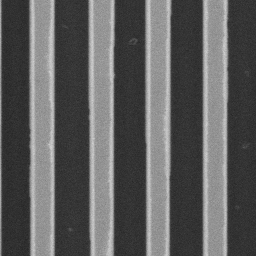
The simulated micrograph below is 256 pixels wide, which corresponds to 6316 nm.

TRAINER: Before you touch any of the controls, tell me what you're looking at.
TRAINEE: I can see lines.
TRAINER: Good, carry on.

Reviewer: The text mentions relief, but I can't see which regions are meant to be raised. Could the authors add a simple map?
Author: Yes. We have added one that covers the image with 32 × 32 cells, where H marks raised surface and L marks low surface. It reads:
LLLLHHHLLLLHHHLLLLHHHLLLLLHHLLLL
LLLLHHHLLLLHHHLLLLHHHLLLLLHHLLLL
LLLLHHHLLLLHHHLLLLHHHLLLLLHHLLLL
LLLLHHHLLLLHHHLLLLHHHLLLLHHHLLLL
LLLLHHHLLLLHHHLLLLHHHLLLLHHHLLLL
LLLLHHHLLLLHHHLLLLHHHLLLLHHHLLLL
LLLLHHHLLLLHHHLLLLHHHLLLLHHHLLLL
LLLLHHHLLLLHHHLLLLHHHLLLLHHHLLLL
LLLLHHHLLLLHHHLLLLHHHLLLLLHHLLLL
LLLLHHHLLLLHHHLLLLHHHLLLLLHHLLLL
LLLLHHHLLLLHHHLLLLHHHLLLLLHHLLLL
LLLLHHHLLLLHHHLLLLHHHLLLLLHHLLLL
LLLLHHHLLLLHHHLLLLHHHLLLLLHHLLLL
LLLLHHHLLLLHHHLLLLHHHLLLLLHHLLLL
LLLLHHHLLLLHHHLLLLHHHLLLLLHHLLLL
LLLLHHHLLLLHHHLLLLHHHLLLLLHHLLLL
LLLLHHHLLLLHHHLLLLHHHLLLLHHHLLLL
LLLLHHHLLLLHHHLLLLHHHLLLLHHHLLLL
LLLLHHHLLLLHHHLLLLHHHLLLLHHHLLLL
LLLLHHHLLLLHHHLLLLHHHLLLLLHHLLLL
LLLLHHHLLLLHHHLLLLHHHLLLLHHHLLLL
LLLLHHHLLLLHHHLLLLHHHLLLLHHHLLLL
LLLLHHHLLLLHHHLLLLHHHLLLLLHHLLLL
LLLLHHHLLLLHHHLLLLHHHLLLLLHHLLLL
LLLLHHHLLLLHHHLLLLHHHLLLLLHHLLLL
LLLLHHHLLLLHHHLLLLHHHLLLLLHHLLLL
LLLLHHHLLLLHHHLLLLHHHLLLLLHHLLLL
LLLLHHHLLLLHHHLLLLHHHLLLLLHHLLLL
LLLLHHHLLLLHHHLLLLHHHLLLLLHHLLLL
LLLLHHHLLLLHHHLLLLHHHLLLLLHHLLLL
LLLLHHHLLLLHHHLLLLHHHLLLLLHHLLLL
LLLLHHHLLLLHHHLLLLHHHLLLLLHHLLLL